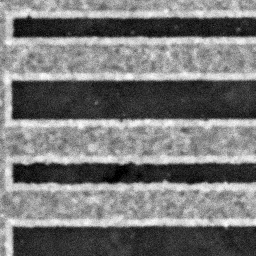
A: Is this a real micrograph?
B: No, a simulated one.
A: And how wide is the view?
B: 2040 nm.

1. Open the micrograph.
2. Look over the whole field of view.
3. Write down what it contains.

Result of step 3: one or a few lines or trenches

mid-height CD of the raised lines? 288 nm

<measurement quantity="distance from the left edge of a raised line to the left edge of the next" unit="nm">581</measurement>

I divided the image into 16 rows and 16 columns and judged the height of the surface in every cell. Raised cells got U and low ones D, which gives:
UUUUUUUUUUUUUUUU
UDDDDDDDDDDDDDDD
UDDDDDDDDDDDDDDD
UUUUUUUUUUUUUUUU
UUUUUUUUUUUUUUUU
UDDDDDDDDDDDDDDD
UDDDDDDDDDDDDDDD
UDDDDDDDDDDDDDDD
UUUUUUUUUUUUUUUU
UUUUUUUUUUUUUUUU
UDDDDDDDDDDDDDDD
UDDDDDDDDDDDDDDD
UUUUUUUUUUUUUUUU
UUUUUUUUUUUUUUUU
UDDDDDDDDDDDDDDD
UDDDDDDDDDDDDDDD